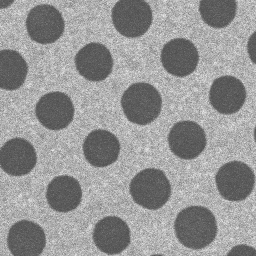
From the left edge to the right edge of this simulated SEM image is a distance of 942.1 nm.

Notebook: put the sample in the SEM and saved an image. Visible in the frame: a regular array of holes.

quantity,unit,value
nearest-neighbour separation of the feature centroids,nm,220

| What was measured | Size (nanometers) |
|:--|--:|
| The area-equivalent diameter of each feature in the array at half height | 143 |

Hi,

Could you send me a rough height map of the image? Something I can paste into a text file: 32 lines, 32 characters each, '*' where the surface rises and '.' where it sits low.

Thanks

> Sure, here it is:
.****.********.....******.....**
****...*******.....******....***
***.....******.....******....***
***.....******.....********.****
****....********..*************.
*****.*****..********...*******.
..********....******.....******.
...******.....******.....******.
...******.....******.....*******
...*******...*********.*****.***
...**************..*******....**
*******.********....******.....*
*****....******.....******.....*
****.....******.....*******...**
*****....*******....************
*****....********.****...*******
***********...*******.....******
*..********....******.....******
....******.....******.....******
.....******....*******...*******
....*******...**************...*
*...*************...*******.....
*******...******.....******.....
******....******.....******.....
******....******.....*******...*
******....*******....***********
**********************....******
*************..*******.....*****
*....*******....******.....*****
*.....******....******.....*****
*.....******....*******...******
*....********..**************...